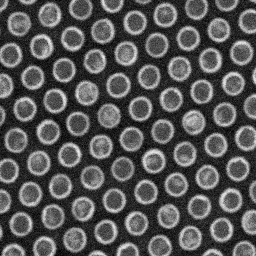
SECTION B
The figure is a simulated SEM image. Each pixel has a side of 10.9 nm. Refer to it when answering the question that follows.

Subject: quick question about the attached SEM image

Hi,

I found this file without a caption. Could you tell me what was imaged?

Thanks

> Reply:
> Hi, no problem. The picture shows a regular array of raised bodies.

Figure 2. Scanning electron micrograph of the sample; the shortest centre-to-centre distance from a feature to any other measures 0.341 um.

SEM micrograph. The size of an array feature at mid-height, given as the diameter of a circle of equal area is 241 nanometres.